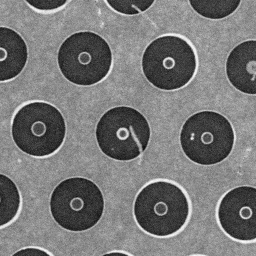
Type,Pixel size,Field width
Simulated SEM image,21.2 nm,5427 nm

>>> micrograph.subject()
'an array of small figures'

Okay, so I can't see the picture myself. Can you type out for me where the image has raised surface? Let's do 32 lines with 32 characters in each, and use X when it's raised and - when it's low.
XXXX----XXXXX------XXXXX------XX
XXXXXXXXXXXXXXX--XXXXXXXX----XXX
XXXXXXXXXXXXXXXXXXXXXXXXXXXXXXXX
-XXXXXXXXXXXXXXXXXXXXXXXXXXXXXXX
---XXXXXX---XXXXXXXX--XXXXXXXXXX
---XXXXX------XXXXX-----XXXXXX--
X--XXXX-------XXXX------XXXXX---
---XXXX---X---XXXX-------XXX----
---XXXX-------XXXX-------XXX---X
--XXXXXX-----XXXXX------XXXX----
XXXXXXXXX---XXXXXXX----XXXXXX---
XXXXXXXXXXXXXXXXXXXXXXXXXXXXXX--
XXXXXXXXXXXXXXXXXXXXXXXXXXXXXXXX
XXX----XXXXXXX---XXXXXXXXXXXXXXX
XX------XXXXX-----XXXXXX----XXXX
X---X---XXXX-------XXXX------XXX
X---XX--XXXX---X---XXXX------XXX
XX------XXXX-------XXXX--X---XXX
XX-----XXXXX------XXXXX------XXX
XXXX--XXXXXXX----XXXXXX-----XXXX
XXXXXXXXXXXXXXXXXXXXXXXXX--XXXXX
XXXXXXXXXXXXXXXXXXXXXXXXXXXXXXXX
-XXXXXXX---XXXXXXXXXXXXXXXXXXXXX
--XXXXX-----XXXXXX-----XXXXXXX--
---XXX-------XXXX------XXXXX----
---XXX---X---XXXX-------XXX-----
--XXXX-------XXXX---X---XXX---X-
--XXXXX-----XXXXX------XXXX-----
XXXXXXXX---XXXXXXX-----XXXXX----
XXXXXXXXXXXXXXXXXXXX-XXXXXXXX---
XXXXXXXXXXXXXXXXXXXXXXXXXXXXXXXX
XX----XXXXXXXX-XXXXXXXXXXXXXXXXX